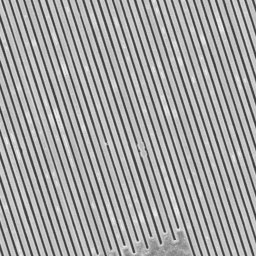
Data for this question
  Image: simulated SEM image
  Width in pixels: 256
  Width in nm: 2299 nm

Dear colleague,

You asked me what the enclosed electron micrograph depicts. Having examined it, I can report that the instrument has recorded parallel lines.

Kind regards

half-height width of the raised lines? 42.8 nanometres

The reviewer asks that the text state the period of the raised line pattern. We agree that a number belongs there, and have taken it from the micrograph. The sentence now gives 63.1 nm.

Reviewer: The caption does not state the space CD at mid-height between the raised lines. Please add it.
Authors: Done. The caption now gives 2.86 pixels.